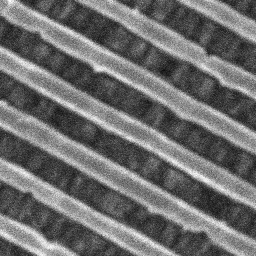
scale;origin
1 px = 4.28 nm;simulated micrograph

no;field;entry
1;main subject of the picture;parallel lines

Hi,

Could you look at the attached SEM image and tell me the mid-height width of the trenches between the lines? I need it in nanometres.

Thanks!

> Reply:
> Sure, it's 125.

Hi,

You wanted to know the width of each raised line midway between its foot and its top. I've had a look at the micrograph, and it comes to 79.9 nm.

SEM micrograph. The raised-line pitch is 0.207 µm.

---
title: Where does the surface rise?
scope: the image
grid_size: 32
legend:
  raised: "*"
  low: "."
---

***........****........*****....
****.........****........*****..
.*****........*****........****.
...*****........*****........***
.....*****........****.........*
.......*****.......*****........
*.......******.......*****......
***........*****.......*****....
*****.......******.......*****..
..*****.......*****........*****
...*****........*****.......****
.....*****........*****.......**
.......*****........****........
*........*****.......*****......
****.......*****.......*****....
*****........*****.......*****..
..*****.......******.......****.
...******.......*****........***
.....******.......*****........*
.......*****........*****.......
*........*****........****......
***........*****.......*****....
*****.......******.......*****..
..*****.......*****........*****
....*****.......*****........***
......****........*****........*
........****........*****.......
*.........****........*****.....
***........*****.......******...
*****........*****........****..
..****.........*****.......*****
....*****........****........***